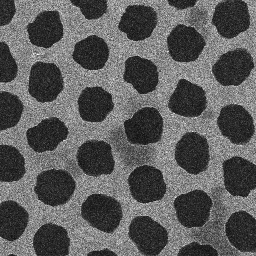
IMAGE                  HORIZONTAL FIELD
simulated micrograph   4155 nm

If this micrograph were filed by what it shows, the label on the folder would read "a regular array of holes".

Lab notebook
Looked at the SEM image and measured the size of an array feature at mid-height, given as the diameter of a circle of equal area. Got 603 nanometres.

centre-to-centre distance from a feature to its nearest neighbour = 0.843 µm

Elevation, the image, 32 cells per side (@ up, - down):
--@@@@@@@----@@@@@@@@---@@@@---@
--@@@@-@@@---@@@---@@@@@@@@----@
-@@@----@@@@@@@----@@@@@@@@----@
@@@-----@@@@@@@----@@@--@@@----@
@@@@----@@@-@@@@---@@----@@@--@@
-@@@---@@@---@@@@@@@@-----@@@@@@
-@@@@@@@@-----@@@@@@@----@@@@--@
--@@@@@@@----@@@---@@@--@@@-----
--@@---@@@@--@@@----@@@@@@@-----
--@@----@@@@@@@-----@@@@@@@----@
@@@@----@@@@@@@@----@@--@@@@--@@
-@@@----@@---@@@@--@@@----@@@@@@
--@@@--@@@----@@@@@@@-----@@@@@@
---@@@@@@@----@@@@-@@-----@@--@@
---@@@@@@@---@@@@---@@@-@@@----@
--@@@---@@@@@@@@----@@@@@@@-----
@@@------@@@@@@@----@@@@@@@@----
@@@-----@@@@@@@@----@@@---@@@--@
--@@---@@@----@@@@@@@@----@@@@@@
---@@@@@@@----@@@@@@@@----@@@@@@
---@@@@@@@----@@@@@@@@----@@----
---@@@--@@@---@@@---@@@@-@@@----
--@@@----@@@@@@@-----@@@@@@@----
@@@@-----@@@@@@@-----@@@@@@@----
@@@@@----@@--@@@@---@@----@@@@-@
--@@@@--@@-----@@@@@@@----@@@@@@
---@@@@@@@-----@@@@@@@----@@@@-@
---@@@@@@@@----@@--@@@----@@@---
---@@---@@@@--@@-----@@@@@@@----
---@----@@@@@@@@-----@@@@@@@----
@@@@-----@@@@@@@@----@@@-@@@@---
@@@@-----@@---@@@@--@@-----@@@@@